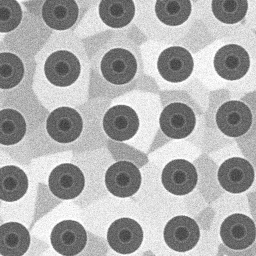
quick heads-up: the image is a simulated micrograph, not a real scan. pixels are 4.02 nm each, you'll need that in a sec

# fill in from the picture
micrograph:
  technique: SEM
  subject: an array of small figures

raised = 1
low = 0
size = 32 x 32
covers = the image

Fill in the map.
00111000001100000110000011000001
00011000001100000110000011100001
00011000001110000111000111100011
00111100011111011111111111111111
11111111111111111111111111111111
11111111111111111111111111111111
11111110011110001111000011100001
00011100001110000111000011100001
00011000001110000111000011100001
00011100001110000111000011100001
00111110011111001111111111111111
11111111111111111111111111111111
11111111111111111111111111111111
11111110011111001111100011100001
00011100001110000111000011100000
00011100001110000111000011100001
00011100001110000111000011110001
00011110011111001111111111111111
11111111111111111111111111111111
11111111111111111111111111111111
11111111011111000111100011110001
00011100001110000111000001100000
00001100000110000011000001100000
00011100000110000111100011110001
00011110001111001111111111111111
11111111111111111111111111111111
11111111111111111111111111111111
11111111011111100111100011110000
00011110000111000011000001110000
00001100000110000011000001110000
00001100000111000011100001110001
00011110001111100111110111111111